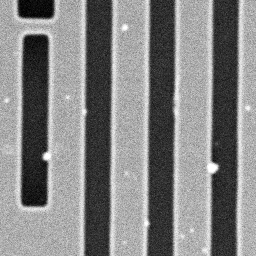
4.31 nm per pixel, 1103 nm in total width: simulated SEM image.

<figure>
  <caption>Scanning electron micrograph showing groups of lines, slits or small figures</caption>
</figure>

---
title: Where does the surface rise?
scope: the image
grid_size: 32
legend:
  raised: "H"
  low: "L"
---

HHLLLLLHHHHLLLHHHHHLLLHHHHHLLLHH
HHLLLLLHHHHLLLHHHHHLLLHHHHHLLLHH
HHHHHHHHHHHLLLHHHHHLLLHHHHLLLLHH
HHHHHHHHHHHLLLHHHHHLLLHHHHLLLLHH
HHHLLLHHHHHLLLHHHHHLLLHHHHLLLLHH
HHHLLLHHHHHLLLHHHHHLLLHHHHLLLLHH
HHHLLLHHHHHLLLHHHHHLLLHHHHLLLLHH
HHHLLLHHHHHLLLHHHHHLLLHHHHLLLLHH
HHHLLLHHHHHLLLHHHHHLLLHHHHLLLLHH
HHHLLLHHHHHLLLHHHHHLLLHHHHLLLLHH
HHHLLLHHHHHLLLHHHHHLLLHHHHLLLLHH
HHHLLLHHHHHLLLHHHHHLLLHHHHLLLLHH
HHHLLLHHHHHLLLHHHHHLLLHHHHLLLLHH
HHHLLLHHHHHLLLHHHHLLLLHHHHLLLLHH
HHHLLLHHHHHLLLHHHHLLLLHHHHLLLLHH
HHHLLLHHHHHLLLHHHHLLLLHHHHLLLLHH
HHHLLLHHHHLLLLHHHHLLLLHHHHLLLLHH
HHHLLLHHHHLLLLHHHHLLLLHHHHLLLLHH
HHHLLLHHHHLLLLHHHHLLLLHHHHLLLLHH
HHHLLLHHHHLLLLHHHHLLLLHHHHLLLLHH
HHHLLLHHHHLLLLHHHHLLLLHHHHHLLLHH
HHHLLLHHHHLLLLHHHHLLLLHHHHHLLLHH
HHLLLLHHHHLLLLHHHHLLLLHHHHLLLLHH
HHLLLLHHHHLLLLHHHHLLLLHHHHLLLLHH
HHLLLLHHHHLLLLHHHHLLLLHHHHLLLLHH
HHHLLLHHHHLLLLHHHHLLLLHHHHLLLLHH
HHHHHHHHHHLLLLHHHHLLLLHHHHLLLLHH
HHHHHHHHHHLLLLHHHHLLLLHHHHLLLLHH
HHHHHHHHHHLLLLHHHHLLLLHHHHLLLLHH
HHHHHHHHHHLLLLHHHHLLLLHHHHLLLLHH
HHHHHHHHHHLLLLHHHHLLLLHHHHLLLLHH
HHHHHHHHHHLLLLHHHHLLLLHHHHLLLLHH